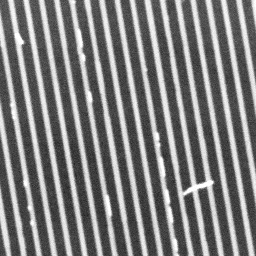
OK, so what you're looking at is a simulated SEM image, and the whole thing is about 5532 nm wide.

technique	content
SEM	parallel lines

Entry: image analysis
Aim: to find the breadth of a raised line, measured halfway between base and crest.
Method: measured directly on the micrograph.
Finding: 58.5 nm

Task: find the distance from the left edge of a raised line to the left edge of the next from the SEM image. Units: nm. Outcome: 324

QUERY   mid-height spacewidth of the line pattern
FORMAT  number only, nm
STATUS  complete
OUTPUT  269